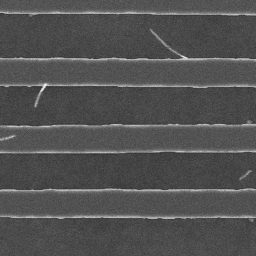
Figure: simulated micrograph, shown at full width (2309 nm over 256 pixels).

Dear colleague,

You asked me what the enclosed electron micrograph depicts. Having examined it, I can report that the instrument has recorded lines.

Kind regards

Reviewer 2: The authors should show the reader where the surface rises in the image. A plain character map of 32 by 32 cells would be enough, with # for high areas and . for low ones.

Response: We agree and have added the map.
################################
################################
................................
................................
................................
................................
................................
################################
################################
################################
################################
................................
................................
................................
................................
................................
################################
################################
################################
................................
................................
................................
................................
................................
################################
################################
################################
................................
................................
................................
................................
................................